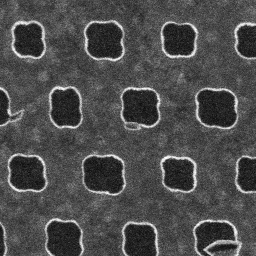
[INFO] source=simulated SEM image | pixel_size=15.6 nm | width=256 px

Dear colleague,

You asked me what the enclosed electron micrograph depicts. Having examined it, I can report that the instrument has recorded a regular array of raised bodies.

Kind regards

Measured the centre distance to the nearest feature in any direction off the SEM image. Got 1170 nanometres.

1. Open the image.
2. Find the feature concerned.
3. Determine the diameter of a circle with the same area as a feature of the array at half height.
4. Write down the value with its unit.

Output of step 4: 616 nanometers